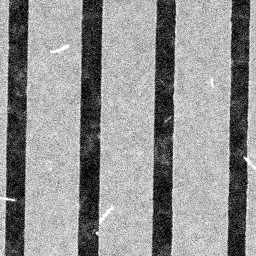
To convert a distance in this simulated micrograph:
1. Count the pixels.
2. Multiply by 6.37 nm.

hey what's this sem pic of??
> one or a few lines or trenches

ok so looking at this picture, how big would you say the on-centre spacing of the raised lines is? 473 nm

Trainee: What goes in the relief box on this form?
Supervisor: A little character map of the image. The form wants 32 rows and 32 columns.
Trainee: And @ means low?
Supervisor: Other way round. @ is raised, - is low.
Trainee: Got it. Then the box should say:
@---@@@@@@---@@@@@@@--@@@@@@@--@
@---@@@@@@---@@@@@@@--@@@@@@@--@
@---@@@@@@---@@@@@@@--@@@@@@@--@
@---@@@@@@---@@@@@@---@@@@@@@--@
@---@@@@@@---@@@@@@---@@@@@@@--@
@---@@@@@@---@@@@@@---@@@@@@@--@
@---@@@@@@---@@@@@@---@@@@@@@--@
@---@@@@@@---@@@@@@---@@@@@@@--@
@---@@@@@@---@@@@@@---@@@@@@@--@
@--@@@@@@@---@@@@@@---@@@@@@@--@
@--@@@@@@@---@@@@@@---@@@@@@@--@
@--@@@@@@@---@@@@@@---@@@@@@@--@
@--@@@@@@@---@@@@@@---@@@@@@@--@
@--@@@@@@@---@@@@@@---@@@@@@@--@
@--@@@@@@@---@@@@@@---@@@@@@@--@
@--@@@@@@@---@@@@@@---@@@@@@@--@
@--@@@@@@@---@@@@@@---@@@@@@@--@
@--@@@@@@@---@@@@@@---@@@@@@@--@
@--@@@@@@@---@@@@@@@--@@@@@@@--@
@--@@@@@@@---@@@@@@---@@@@@@@--@
@--@@@@@@@---@@@@@@---@@@@@@@--@
@--@@@@@@@---@@@@@@---@@@@@@@--@
@--@@@@@@@---@@@@@@---@@@@@@@--@
@--@@@@@@@---@@@@@@---@@@@@@@--@
@--@@@@@@@---@@@@@@---@@@@@@---@
@--@@@@@@@--@@@@@@@---@@@@@@---@
@--@@@@@@@--@@@@@@@---@@@@@@---@
@--@@@@@@@--@@@@@@@---@@@@@@---@
@--@@@@@@@-@@@@@@@@---@@@@@@---@
@--@@@@@@@--@@@@@@@---@@@@@@---@
@--@@@@@@@--@@@@@@@---@@@@@@---@
---@@@@@@@--@@@@@@@--@@@@@@@---@